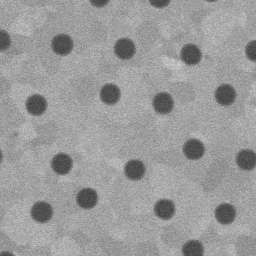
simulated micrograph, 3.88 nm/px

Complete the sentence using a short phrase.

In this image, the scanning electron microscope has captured a regular array of holes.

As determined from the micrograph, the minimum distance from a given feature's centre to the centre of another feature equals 199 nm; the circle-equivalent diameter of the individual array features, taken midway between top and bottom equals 0.0884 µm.